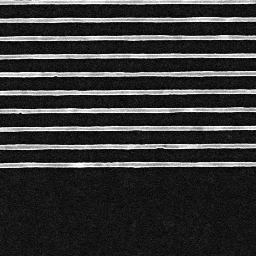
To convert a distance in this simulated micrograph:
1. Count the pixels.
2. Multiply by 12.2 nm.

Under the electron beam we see parallel lines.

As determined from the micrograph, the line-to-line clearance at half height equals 14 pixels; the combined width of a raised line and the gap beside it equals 222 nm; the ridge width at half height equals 49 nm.